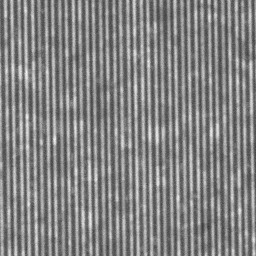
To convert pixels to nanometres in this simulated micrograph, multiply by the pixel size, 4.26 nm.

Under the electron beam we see parallel lines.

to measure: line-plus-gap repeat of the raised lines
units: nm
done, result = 28.9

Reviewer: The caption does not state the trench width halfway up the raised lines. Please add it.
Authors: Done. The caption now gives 20.2 nm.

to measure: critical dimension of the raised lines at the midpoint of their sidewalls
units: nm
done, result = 8.5